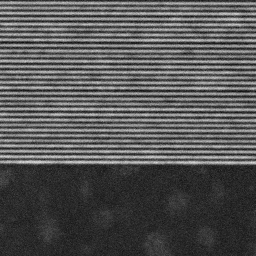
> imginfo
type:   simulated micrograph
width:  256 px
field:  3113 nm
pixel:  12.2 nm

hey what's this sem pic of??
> parallel lines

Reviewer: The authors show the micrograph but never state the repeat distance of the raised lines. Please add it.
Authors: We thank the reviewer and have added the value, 64.5 nm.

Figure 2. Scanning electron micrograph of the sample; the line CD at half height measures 10.6 nm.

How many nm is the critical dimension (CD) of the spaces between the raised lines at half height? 45.6